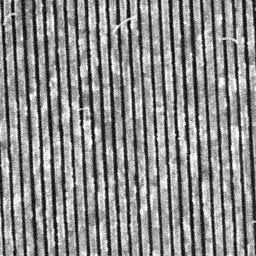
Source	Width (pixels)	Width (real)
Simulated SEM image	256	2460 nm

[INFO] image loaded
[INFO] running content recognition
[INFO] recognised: parallel lines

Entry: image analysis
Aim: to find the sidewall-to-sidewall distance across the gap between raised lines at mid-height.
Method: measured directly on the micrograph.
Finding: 42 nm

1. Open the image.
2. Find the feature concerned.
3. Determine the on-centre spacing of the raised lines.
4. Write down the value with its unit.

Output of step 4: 101 nanometres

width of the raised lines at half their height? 57.6 nanometres